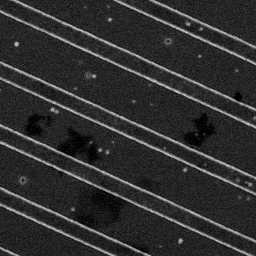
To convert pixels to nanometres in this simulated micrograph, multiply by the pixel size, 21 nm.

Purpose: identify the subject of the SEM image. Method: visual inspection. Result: lines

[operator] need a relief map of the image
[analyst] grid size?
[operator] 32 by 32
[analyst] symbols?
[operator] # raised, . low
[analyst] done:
###............#####............
#####............#####..........
..#####.............####........
....#####.............#####.....
.......#####............#####...
.........#####............#####.
...........#####.............###
.............#####.............#
##.............#####............
####..............#####.........
.#####..............#####.......
....####..............#####.....
......#####.............#####...
........#####..............#####
..........#####..............###
............#####..............#
##.............####.............
####.............#####..........
.#####.............#####........
....#####............#####......
......#####.............####....
........#####.............####..
..........#####.............####
............#####.............##
##.............#####............
####.............#####..........
..#####............#####........
....#####............#####......
......#####............#####....
........#####.............#####.
...........####.............####
#............#####............##